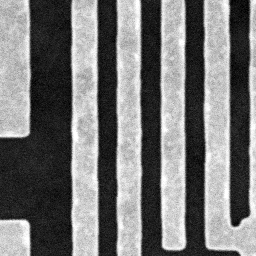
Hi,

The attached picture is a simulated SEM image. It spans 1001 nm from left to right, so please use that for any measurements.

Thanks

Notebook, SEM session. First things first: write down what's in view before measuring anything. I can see wiring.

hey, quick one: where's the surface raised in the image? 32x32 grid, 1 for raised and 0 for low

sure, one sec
11100000011100011000111000110001
11110000011100011000111000111001
11110000011100011000111000110001
11110000011100011000111000110001
11110000011100011000111000111001
11110000011100011000111000111001
11110000011100011000111000111001
11110000011100011000111000111001
11110000011100011000111000111001
11110000011100011000111000111001
11110000011100011000111000111001
11110000011100011000111000111001
11110000011100011000111000111001
11110000011100011000111000111001
11110000011100011000111000111001
11110000011100011000111000111001
11110000011100011100111000111001
00000000011100011000111000111001
00000000011100011000111000111001
00000000011100011000111000111001
00000000011100011000111000111001
00000000011100011100111000111001
00000000011100011000111000111001
00000000011100011000111000111001
00000000011100011000111000111001
00000000011100011000111000111001
00000000011100011000111000111001
00000000011100011100111000111001
11110000011100011100111000111111
11110000011100011100111000111111
11110000011100011000111000111111
11110000011100011000000000000011